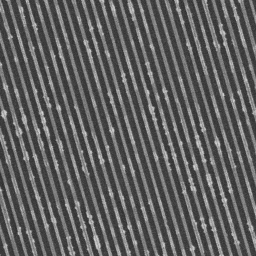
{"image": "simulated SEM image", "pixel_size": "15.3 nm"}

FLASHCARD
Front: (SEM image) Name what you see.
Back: parallel lines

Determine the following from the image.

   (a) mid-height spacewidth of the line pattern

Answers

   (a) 0.0865 µm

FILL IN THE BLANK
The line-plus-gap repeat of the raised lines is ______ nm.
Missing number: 137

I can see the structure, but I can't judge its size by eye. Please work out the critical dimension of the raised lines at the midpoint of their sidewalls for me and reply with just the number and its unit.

44.1 nm